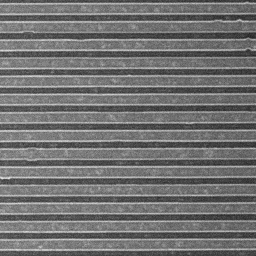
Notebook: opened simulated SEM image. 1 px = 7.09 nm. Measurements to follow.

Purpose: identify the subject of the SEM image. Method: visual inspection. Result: parallel lines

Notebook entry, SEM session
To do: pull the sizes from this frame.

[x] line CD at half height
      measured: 76.2 nanometers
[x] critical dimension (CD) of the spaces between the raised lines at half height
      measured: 0.0514 microns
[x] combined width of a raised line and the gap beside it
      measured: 0.128 um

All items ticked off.